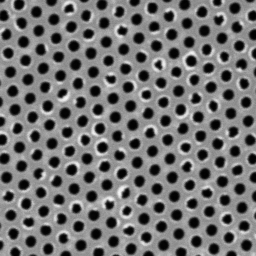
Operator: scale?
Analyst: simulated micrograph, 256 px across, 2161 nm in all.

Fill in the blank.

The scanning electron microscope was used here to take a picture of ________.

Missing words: a regular array of holes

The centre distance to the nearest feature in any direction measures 157 nm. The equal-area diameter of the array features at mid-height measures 96.6 nm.